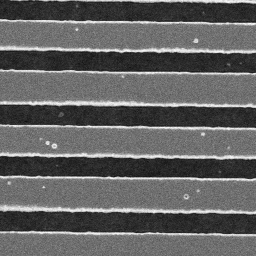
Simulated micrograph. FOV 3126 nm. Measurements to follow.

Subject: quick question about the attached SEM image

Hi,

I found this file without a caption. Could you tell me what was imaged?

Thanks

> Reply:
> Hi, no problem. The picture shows lines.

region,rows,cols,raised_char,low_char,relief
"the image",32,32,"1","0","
00000000000000000000000000000000
00000000000000000000000000000000
10100000000000000000000000000000
11111111111111111111111111111111
11111111111111111111111111111111
11111111111111111111111111111111
00000000000000010000001110111111
00000000000000000000000000000000
00000000000000000000000000000000
11111111111111111111111111111111
11111111111111111111111111111111
11111111111111111111111111111111
11111111111111111111111111111111
00000000000000000000000000000000
00000000000000000000000000000000
00000000000000000000000000000000
11111111111111111111111111111111
11111111111111111111111111111111
11111111111111111111111111111111
01011111111111111111111111111111
00000000000000000000000000000000
00000000000000000000000000000000
11111111111111111111111111111111
11111111111111111111111111111111
11111111111111111111111111111111
11111111111111111111111111111111
00000000000011011111111111111111
00000000000000000000000000000000
00000000000000000000000000000000
11111111111111111111111111111111
11111111111111111111111111111111
11111111111111111111111111111111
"